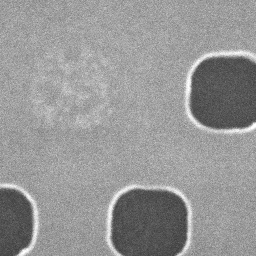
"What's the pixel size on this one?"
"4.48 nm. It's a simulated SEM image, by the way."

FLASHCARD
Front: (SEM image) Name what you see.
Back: holes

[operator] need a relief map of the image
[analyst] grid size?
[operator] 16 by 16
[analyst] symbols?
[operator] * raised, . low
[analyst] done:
****************
****************
****************
**************.*
************....
************....
************....
************....
****************
****************
****************
****************
..*****....*****
..*****.....****
..*****.....****
..*****....*****